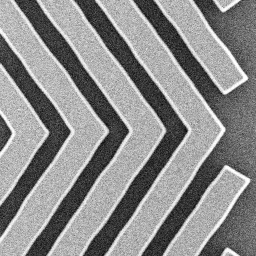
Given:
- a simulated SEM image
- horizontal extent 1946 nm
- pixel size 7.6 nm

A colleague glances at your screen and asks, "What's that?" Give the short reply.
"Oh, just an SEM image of groups of lines, slits or small figures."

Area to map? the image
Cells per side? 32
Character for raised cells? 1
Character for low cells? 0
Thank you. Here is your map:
11000111100011111000111100011000
11100011110001111000111110000000
11100011111000111100011111000000
11110001111000011110001111000000
11111000111100011111000111100000
01111000011110001111000111110000
00111100001111000111100011111000
00011110001111000111110001111000
00011111000111100011111000111100
10001111100111110001111000111110
11000111100011111000111100011100
11100011110001111000111110000000
11100011111000111100011110000000
11110001111000111110001111000000
11111000111100011111000111100000
01111000111110001111000111110000
00111100011110001111100011110000
01111000111110001111000111100000
01111000111100011110001111100000
11110001111000111110001111000000
11110011111000111100011110000000
11100011110001111000111100001000
11000111100011111000111100011110
11001111100011110001111000111100
10001111000111100011111001111100
00011110001111100111110001111000
00111110001111000111100011110000
00111100011110001111000111110000
01111000111110001111000111100000
11111000111100011110001111000000
11110001111000111100011111000000
11100011110000111100011110001000